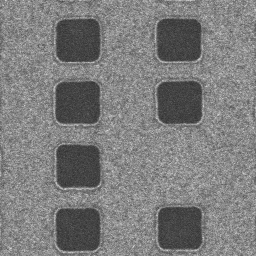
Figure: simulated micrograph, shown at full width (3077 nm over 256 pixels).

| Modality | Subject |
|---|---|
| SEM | holes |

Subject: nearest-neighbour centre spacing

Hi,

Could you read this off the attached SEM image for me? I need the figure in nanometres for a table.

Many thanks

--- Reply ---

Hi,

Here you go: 752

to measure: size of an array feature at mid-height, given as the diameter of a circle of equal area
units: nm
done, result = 585